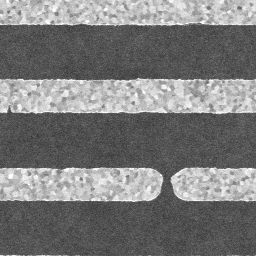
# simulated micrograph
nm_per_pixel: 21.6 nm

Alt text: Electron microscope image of one or a few lines or trenches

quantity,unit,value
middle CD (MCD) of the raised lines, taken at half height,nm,696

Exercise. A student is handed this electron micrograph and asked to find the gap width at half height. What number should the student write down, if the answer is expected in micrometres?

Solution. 1.21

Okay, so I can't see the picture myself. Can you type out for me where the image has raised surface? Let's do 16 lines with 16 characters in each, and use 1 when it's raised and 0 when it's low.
1111111111111111
1111101111100011
0000000000000000
0000000000000000
0000000000000000
1111111111111111
1111111111111111
0000000000000000
0000000000000000
0000000000000000
0000000000000000
1111111111011111
1101111110001111
0000000000000000
0000000000000000
0000000000000000